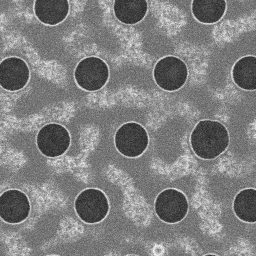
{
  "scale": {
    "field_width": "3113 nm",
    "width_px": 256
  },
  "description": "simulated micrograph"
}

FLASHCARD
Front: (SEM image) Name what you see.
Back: holes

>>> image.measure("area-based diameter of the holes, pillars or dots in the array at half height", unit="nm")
412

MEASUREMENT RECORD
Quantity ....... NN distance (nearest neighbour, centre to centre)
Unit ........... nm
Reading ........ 928